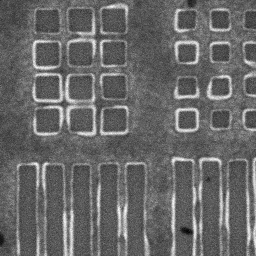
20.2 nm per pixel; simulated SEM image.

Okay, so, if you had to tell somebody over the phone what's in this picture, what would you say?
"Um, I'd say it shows groups of lines, slits or small figures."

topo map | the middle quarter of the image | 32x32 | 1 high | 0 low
11000001110000011111111111111111
11111111111111111111111111111111
11111111111111111111111111111111
10000001100000001111111111111000
10000001100000001111111111110000
10000001100000001111111111110000
00000001100000001111111111110000
10000001100000001111111111110000
10000000110000001111111111111111
11110011111111111111111111111111
11110001111111111111111111111111
10000000110000001111111111111000
10000000100000001111111111110000
10000000100000001111111111110000
10000000100000001111111111110000
10000000100000001111111111110000
10000000100000001111111111111000
11110001110011111111111111111111
11111111111111111111111111111111
11111111111111111111111111111111
11111111111111111111111111111111
11111111111111111111111111111111
11111111111111111111111111111111
11111111111111111111111111111111
11111111111111111111111111100000
11000011100001110000111111100000
11000001100000100000011111100000
11000001100000100000011111100000
11000001100000100000011111100000
11000001100000100000011111100000
11000001100000100000011111100000
11000001100000110000111111100000